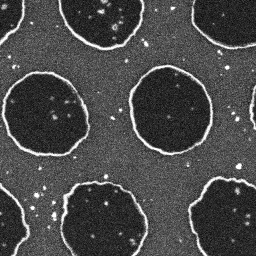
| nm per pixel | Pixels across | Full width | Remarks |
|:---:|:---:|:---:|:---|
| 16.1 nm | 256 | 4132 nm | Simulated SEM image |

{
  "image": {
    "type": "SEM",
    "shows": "raised bodies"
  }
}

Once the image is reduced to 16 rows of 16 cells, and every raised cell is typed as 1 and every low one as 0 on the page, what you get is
1000111110001111
1000111110001111
0000011100000111
0000000000000000
0000000001110000
0111100011111000
1111100011111000
1111100011111000
0111100001111000
0011000000100000
0000000000000000
0000011000000111
1000111100001111
1000111110001111
1100111110001111
1000111110000111